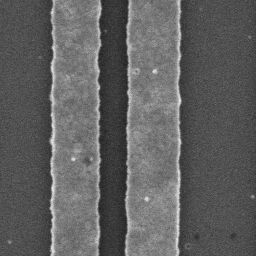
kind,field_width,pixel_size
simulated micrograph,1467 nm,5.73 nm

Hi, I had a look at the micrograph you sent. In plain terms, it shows lines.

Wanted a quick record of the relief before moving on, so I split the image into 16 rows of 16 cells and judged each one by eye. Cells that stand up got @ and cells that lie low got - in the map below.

---@@@--@@@-----
---@@@--@@@-----
---@@@--@@@-----
---@@@--@@@-----
---@@@--@@@-----
---@@@--@@@-----
---@@@--@@@-----
---@@@--@@@-----
---@@@--@@@-----
---@@@--@@@-----
---@@@--@@@-----
---@@@--@@@-----
---@@@--@@@-----
---@@@--@@@-----
---@@@--@@@-----
---@@@--@@@-----